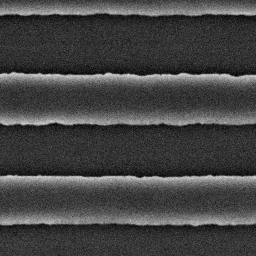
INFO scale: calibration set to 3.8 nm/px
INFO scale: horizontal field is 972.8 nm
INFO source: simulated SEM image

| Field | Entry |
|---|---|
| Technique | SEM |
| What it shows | lines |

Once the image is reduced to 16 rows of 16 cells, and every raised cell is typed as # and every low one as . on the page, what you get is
################
................
................
................
................
################
################
################
................
................
................
################
################
################
................
................